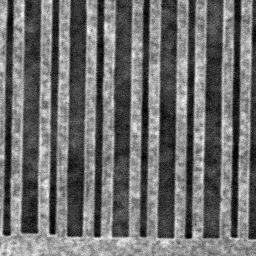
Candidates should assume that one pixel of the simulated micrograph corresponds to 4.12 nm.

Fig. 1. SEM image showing parallel lines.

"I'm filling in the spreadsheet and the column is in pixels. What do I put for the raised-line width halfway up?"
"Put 9.88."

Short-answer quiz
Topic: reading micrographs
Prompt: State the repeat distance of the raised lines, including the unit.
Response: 93.6 nm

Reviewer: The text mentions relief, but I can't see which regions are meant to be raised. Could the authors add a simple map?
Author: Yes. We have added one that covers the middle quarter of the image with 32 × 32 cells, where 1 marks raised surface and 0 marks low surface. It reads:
10000011001100000110011100001110
10000011001100000111011100001110
10000011001100000111011100001110
10000011001100000111011100001110
10000011001100000110011100001110
10000011001100000111011100001110
10000011001100000110011100001110
10000011001100000110011100001110
10000011001100000110011100001110
10000011001100000110011100001110
10000111001100000110011100001100
10000111001100000110011100001100
10000111001100000110011100001100
10000111001100000110011100001100
10000111001100000110011100001100
10000111001100000110011100001100
10000111001100000110011100001100
10000111001100000110011100001100
10000111001100000110011100001100
10000111001100000110011100001100
10000111001100000110011100001100
10000111001100000110011100001100
10000111001100000110011100001100
10000111001100000110011100001100
10000111001100000110011100001100
10000110001100000110011100001100
10000110001100000110011000001100
00000110001100001110011000001100
00000110001100001110011000001100
00000110001100001110011000001100
00000110001100001110011000001100
10000110001100001110011000001100